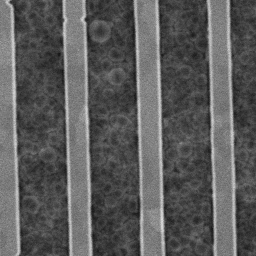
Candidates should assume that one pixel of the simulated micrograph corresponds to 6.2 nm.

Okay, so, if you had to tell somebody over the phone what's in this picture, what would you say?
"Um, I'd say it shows one or a few lines or trenches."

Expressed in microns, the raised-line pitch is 0.448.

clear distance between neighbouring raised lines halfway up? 320 nm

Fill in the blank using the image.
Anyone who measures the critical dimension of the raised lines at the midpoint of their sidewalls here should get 127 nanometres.